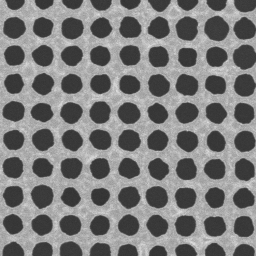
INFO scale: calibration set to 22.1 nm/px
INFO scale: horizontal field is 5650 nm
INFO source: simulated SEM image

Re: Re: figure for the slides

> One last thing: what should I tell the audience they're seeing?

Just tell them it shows a regular array of holes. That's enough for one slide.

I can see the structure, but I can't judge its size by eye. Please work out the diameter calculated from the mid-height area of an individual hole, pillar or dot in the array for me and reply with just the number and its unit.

0.465 um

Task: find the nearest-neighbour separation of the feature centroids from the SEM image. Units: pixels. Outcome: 27.9